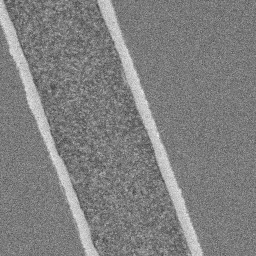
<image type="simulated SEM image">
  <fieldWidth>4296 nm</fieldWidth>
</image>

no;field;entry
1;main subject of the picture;one or a few lines or trenches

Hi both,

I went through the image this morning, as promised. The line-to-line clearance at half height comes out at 1.63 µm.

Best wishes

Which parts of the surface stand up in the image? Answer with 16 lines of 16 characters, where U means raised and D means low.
DDDDDDDUUUUUUUUU
UDDDDDDUUUUUUUUU
UDDDDDDUUUUUUUUU
UDDDDDDDUUUUUUUU
UUDDDDDDUUUUUUUU
UUDDDDDDUUUUUUUU
UUDDDDDDDUUUUUUU
UUUDDDDDDUUUUUUU
UUUDDDDDDDUUUUUU
UUUDDDDDDDUUUUUU
UUUUDDDDDDUUUUUU
UUUUDDDDDDDUUUUU
UUUUUDDDDDDUUUUU
UUUUUDDDDDDUUUUU
UUUUUDDDDDDDUUUU
UUUUUUDDDDDDUUUU